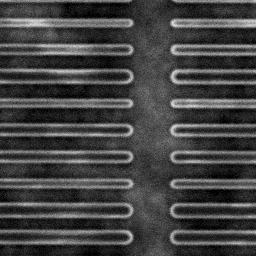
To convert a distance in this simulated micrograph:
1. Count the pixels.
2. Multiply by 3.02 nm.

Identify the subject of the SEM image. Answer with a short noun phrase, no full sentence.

groups of lines, slits or small figures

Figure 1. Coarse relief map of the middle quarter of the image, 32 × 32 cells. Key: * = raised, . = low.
................................
........********.............*..
*****************..........*****
*****************..........*****
****************............****
................................
................................
................................
................................
*****************..........*****
*****************..........****.
................................
................................
................................
................................
****************.............*..
*****************..........*****
****************...........*****
................................
................................
................................
................................
*****************..........*****
*****************..........*****
................................
................................
................................
................................
................................
*****************..........*****
*****************..........*****
................................